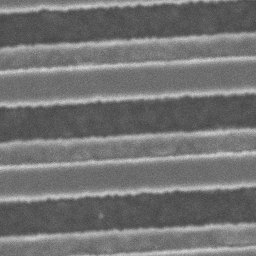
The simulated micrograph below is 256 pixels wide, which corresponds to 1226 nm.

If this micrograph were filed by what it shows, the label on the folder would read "lines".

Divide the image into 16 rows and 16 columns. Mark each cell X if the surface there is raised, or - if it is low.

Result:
XXXXX-----------
----------------
----------XXXXXX
XXXXXXXXXXXXXXXX
XXXXXXXXXXXXXXXX
XXXXXXXXXXXXXXXX
XXX-------------
----------------
---------XXXXXXX
XXXXXXXXXXXXXXXX
XXXXXXXXXXXXXXXX
XXXXXXXXXXXXXXXX
X---------------
----------------
--------XXXXXXXX
XXXXXXXXXXXXXXXX